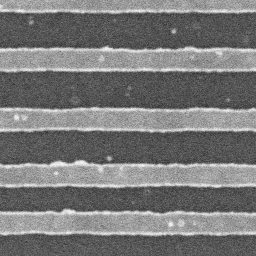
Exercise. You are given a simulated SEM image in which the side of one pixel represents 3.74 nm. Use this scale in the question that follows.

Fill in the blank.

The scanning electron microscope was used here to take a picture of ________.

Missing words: lines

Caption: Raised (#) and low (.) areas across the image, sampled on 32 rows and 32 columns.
################################
..............#.................
................................
................................
................................
................................
################################
################################
################################
................................
................................
................................
................................
................................
################################
################################
................................
................................
................................
................................
.......#.##.....................
################################
################################
................................
................................
................................
......#.#......###....#.........
################################
################################
................................
................................
................................